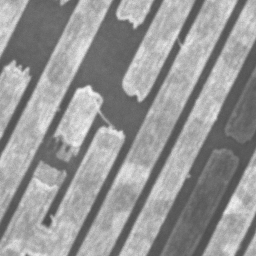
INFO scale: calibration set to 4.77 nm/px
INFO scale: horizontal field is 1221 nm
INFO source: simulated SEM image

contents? parallel lines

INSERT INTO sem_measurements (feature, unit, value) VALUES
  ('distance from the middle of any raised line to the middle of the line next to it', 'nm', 178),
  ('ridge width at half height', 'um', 0.127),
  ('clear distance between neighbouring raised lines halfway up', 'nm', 50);